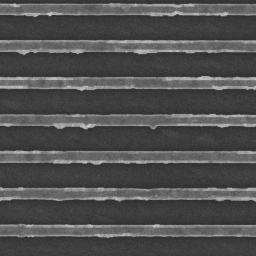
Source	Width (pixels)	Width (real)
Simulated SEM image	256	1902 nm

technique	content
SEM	parallel lines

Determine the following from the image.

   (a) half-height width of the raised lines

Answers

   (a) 81.8 nanometers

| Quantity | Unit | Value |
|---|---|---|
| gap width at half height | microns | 0.192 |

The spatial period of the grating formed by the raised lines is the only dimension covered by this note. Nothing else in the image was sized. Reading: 274 nanometres